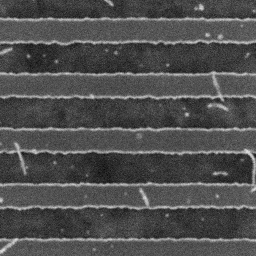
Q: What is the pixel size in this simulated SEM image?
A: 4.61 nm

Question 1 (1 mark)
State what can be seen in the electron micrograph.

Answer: lines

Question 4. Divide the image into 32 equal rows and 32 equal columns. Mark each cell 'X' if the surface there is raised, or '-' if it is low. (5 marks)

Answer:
--------------------------------
--------------------------------
XXXXXXXXXXXXXXXXXXXXXXXXXXXXXXXX
XXXXXXXXXXXXXXXXXXXXXXXXXXXXXXXX
XXXXXXXXXXXXXXXXXXXXXXXXXXXXXXXX
--------------------------------
--------------------------------
--------------------------------
--------------------------------
XXXXXXXXXXXXXXXXXXXXXXXXXXXXXXXX
XXXXXXXXXXXXXXXXXXXXXXXXXXXXXXXX
XXXXXXXXXXXXXXXXXXXXXXXXXXXXXXXX
--------------------------------
--------------------------------
--------------------------------
--------------------------------
XXXXXXXXXXXXXXXXXXXXXXXXXXXXXXXX
XXXXXXXXXXXXXXXXXXXXXXXXXXXXXXXX
XXXXXXXXXXXXXXXXXXXXXXXXXXXXXXXX
--------------------------------
--------------------------------
--------------------------------
--------------------------------
XXXXXXXXXXXXXXXXXXXXXXXXXXXXXXXX
XXXXXXXXXXXXXXXXXXXXXXXXXXXXXXXX
XXXXXXXXXXXXXXXXXXXXXXXXXXXXXXXX
--------------------------------
--------------------------------
--------------------------------
--------------------------------
XXXXXXXXXXXXXXXXXXXXXXXXXXXXXXXX
XXXXXXXXXXXXXXXXXXXXXXXXXXXXXXXX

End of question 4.